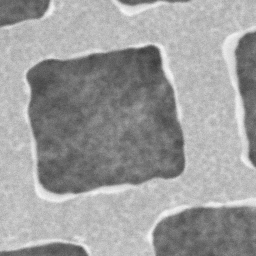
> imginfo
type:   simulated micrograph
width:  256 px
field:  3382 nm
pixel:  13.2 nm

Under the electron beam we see holes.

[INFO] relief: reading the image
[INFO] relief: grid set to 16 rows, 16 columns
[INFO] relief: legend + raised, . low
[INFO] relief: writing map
...+++++++++++++
.+++++++++++++++
+++++++++++++++.
+++++.....++++..
++........+++++.
++.........++++.
++.........++++.
++.........++++.
++.........++++.
++..........+++.
++..........++++
++.......+++++++
++++++++++++++++
++++++++++......
++++++++++......
+....+++++......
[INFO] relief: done